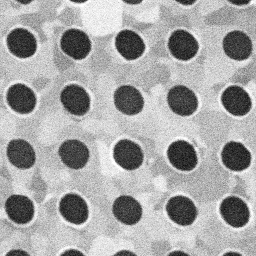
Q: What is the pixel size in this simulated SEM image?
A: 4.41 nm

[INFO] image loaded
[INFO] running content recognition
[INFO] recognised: a regular array of holes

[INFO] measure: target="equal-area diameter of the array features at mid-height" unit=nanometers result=137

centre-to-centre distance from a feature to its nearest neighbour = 53.7 pixels